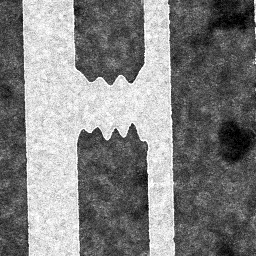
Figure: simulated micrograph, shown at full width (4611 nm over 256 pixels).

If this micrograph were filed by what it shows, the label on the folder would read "one or a few lines or trenches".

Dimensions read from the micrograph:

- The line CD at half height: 770 nm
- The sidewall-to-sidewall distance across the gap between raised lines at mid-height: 1290 nanometers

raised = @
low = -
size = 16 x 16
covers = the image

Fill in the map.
-@@@@----@@-----
--@@@----@@-----
--@@@----@@-----
--@@@----@@-----
--@@@----@@-----
--@@@@@@@@@-----
--@@@@@@@@@-----
--@@@@@@@@@-----
--@@@----@@-----
--@@@----@@-----
--@@@----@@-----
--@@@----@@-----
--@@@----@@-----
--@@@----@@-----
--@@@----@@-----
--@@@----@@-----